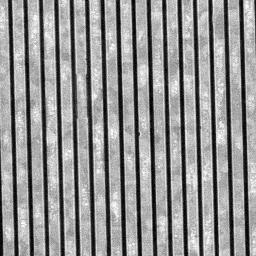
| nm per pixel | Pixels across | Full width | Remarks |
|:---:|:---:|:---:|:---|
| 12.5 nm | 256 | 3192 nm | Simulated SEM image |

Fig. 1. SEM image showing parallel lines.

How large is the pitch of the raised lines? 192 nanometres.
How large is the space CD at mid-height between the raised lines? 59.2 nm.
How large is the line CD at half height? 142 nanometres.